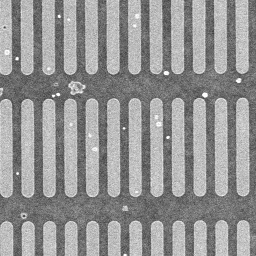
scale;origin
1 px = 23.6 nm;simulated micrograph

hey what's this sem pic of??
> groups of lines, slits or small figures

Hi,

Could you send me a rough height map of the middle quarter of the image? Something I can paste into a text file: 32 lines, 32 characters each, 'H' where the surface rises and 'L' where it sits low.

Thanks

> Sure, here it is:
HHHLLLHHLLLHHHLLHHHLLLHHLLLHHHLL
HHHLLLHHLLLHHHLLHHHLLLHHLLLHHHLL
LHLLLLLLLLLLLLLLLLLLLLLLLHLLLLLL
LLLLLLLLLLLLLLLLLLLLLLLLLLLLLLLL
LLHLLLLLLLLLLLLLLLLLLLLLLLLLLLLL
LHHHHLLLLLLLLLLLLLLLLLLLLLLLLLLL
LLHHLLLLLLLLLLLLLLLLLLLLLLLLLLLL
LLHLLLLLLLLLLLLLLLLLLLLLLLLLLLLL
LLLLLLLLLLLLLLLLLLLLLLLLLLLLLLLL
HHHLLLHHLLLHHHLLHHHLLLHHLLLHHHLL
HHHLLLHHLLLHHHLLHHHLLLHHLLLHHHLL
HHHLLLHHLLLHHHLLHHHLLLHHLLLHHHLL
HHHLLLHHLLLHHHLLHHHLLLHHLLLHHHLL
HHHLLLHHLLLHHHLLHHHLLLHHLLLHHHLL
HHHLLLHHLLLHHHLLHHHLLLHHLLLHHHLL
HHHLLLHHLLLHHHLLHHHLLLHHLLLHHHLL
HHHLLLHHLLLHHHLLHHHLLLHHLLLHHHLL
HHHLLLHHLLLHHHLLHHHLLLHHLLLHHHLL
HHHLLLHHLLLHHHLLHHHLLLHHLLLHHHLL
HHHLLLHHHLLHHHLLHHHLLLHHLLLHHHLL
HHHLLLHHHLLHHHLLHHHLLLHHHLLHHHLL
HHHLLLHHHLLHHHLLHHHLLLHHHLLHHHLL
HHHLLLHHHLLHHHLLHHHLLLHHHLLHHHLL
HHHLLLHHHLLHHHLLHHHLLLHHHLLHHHLL
HHHLLLHHHLLHHHLLHHHLLLHHHLLHHHLL
HHHLLLHHHLLHHHLLHHHLLLHHHLLHHHLL
HHHLLLHHHLLHHHLLHHHLLLHHHLLHHHLL
HHHLLLHHHLLHHHLLHHHLLLHHHLLHHHLL
HHHLLLHHHLLHHHLLHHHLLLHHHLLHHHLL
HHHLLLHHHLLHHHLLHHHLLLHHHLLHHHLL
HHHLLLHHHLLHHHLLHHHLLLHHHLLHHHLL
HHHLLLHHHLLHHHLLHHHLLLHHHLLHHHLL